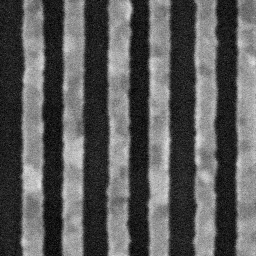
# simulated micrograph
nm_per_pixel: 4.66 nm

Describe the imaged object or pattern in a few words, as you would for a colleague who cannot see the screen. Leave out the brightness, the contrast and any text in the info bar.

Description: lines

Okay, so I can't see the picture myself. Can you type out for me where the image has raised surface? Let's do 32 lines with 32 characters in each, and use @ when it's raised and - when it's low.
---@@---@@----@@---@@----@@---@@
---@@---@@----@@---@@----@@---@@
---@@---@@----@@---@@----@@---@@
---@@---@@----@@---@@----@@---@@
---@@---@@----@@---@@----@@---@@
---@@---@@----@@---@@----@@---@@
---@@---@@----@@---@@---@@@---@@
---@@---@@----@@---@@---@@@---@@
---@@---@@----@@---@@----@@---@@
---@@---@@----@@---@@----@@---@@
---@@---@@----@@---@@----@@---@@
---@@---@@----@@---@@----@@---@@
---@@---@@----@@---@@----@@---@@
---@@---@@----@@---@@---@@@---@@
---@@---@@----@@---@@---@@@---@@
---@@---@@----@@---@@----@@---@@
---@@---@@----@@---@@----@@---@@
---@@---@@----@@---@@----@@---@@
---@@---@@----@@---@@---@@@---@@
---@@---@@----@@---@@---@@@---@@
---@@---@@----@@---@@----@@---@@
---@@---@@----@@---@@----@@---@@
---@@---@@----@@---@@---@@@---@@
---@@---@@----@@---@@---@@@---@@
---@@---@@---@@@---@@---@@@---@@
---@@---@@----@@---@@----@@---@@
---@@---@@----@@---@@----@@---@@
---@@---@@----@@---@@---@@@---@@
---@@---@@----@@---@@----@@---@@
---@@---@@----@@---@@---@@@---@@
---@@---@@----@@---@@---@@@---@@
---@@---@@----@@---@@---@@@---@@